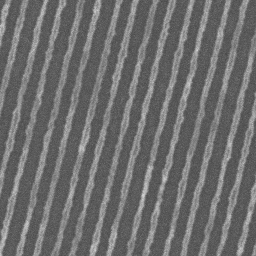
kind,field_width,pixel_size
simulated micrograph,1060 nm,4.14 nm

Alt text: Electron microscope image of parallel lines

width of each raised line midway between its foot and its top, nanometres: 19.1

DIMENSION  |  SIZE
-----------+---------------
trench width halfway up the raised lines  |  53.7 nm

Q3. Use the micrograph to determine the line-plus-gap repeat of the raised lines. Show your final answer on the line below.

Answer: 73.7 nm